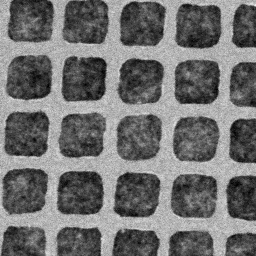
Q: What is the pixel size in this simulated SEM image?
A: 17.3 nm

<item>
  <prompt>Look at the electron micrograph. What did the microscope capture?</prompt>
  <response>a regular array of holes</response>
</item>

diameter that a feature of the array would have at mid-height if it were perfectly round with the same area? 0.848 micrometres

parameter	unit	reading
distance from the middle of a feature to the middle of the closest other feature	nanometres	962